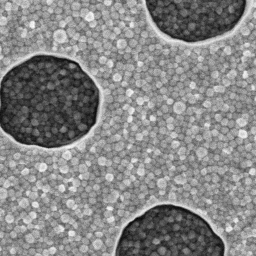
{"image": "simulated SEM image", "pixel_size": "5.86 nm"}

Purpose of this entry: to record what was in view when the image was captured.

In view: holes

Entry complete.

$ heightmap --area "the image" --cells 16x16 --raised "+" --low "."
+++++++++......+
++++++++++.....+
+++++++++++..+++
++..++++++++++++
+....+++++++++++
......++++++++++
......++++++++++
......++++++++++
+....+++++++++++
++++++++++++++++
++++++++++++++++
++++++++++++++++
++++++++++++++++
+++++++++...++++
++++++++.....+++
+++++++.......++